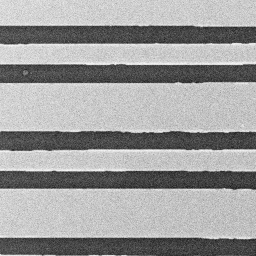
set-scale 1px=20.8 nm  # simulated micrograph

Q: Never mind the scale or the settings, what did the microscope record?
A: lines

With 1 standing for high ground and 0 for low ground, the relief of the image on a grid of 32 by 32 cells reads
11111111111111111111111111111111
11111111111111111111111111111111
11111111111111111111111111111111
00000000000000000000000000000000
00000000000000000000000000000000
00000000000000000000000000000000
11111111111111111111111111111111
11111111111111111111111111111111
00000000000000000000000000000000
00000000000000000000000000000000
11111111111111111111111111111111
11111111111111111111111111111111
11111111111111111111111111111111
11111111111111111111111111111111
11111111111111111111111111111111
11111111111111111111111111111111
00000000000000000000000000000000
00000000000000000000000000000000
00000000000000000000000000000000
11111111111111111111111111111111
11111111111111111111111111111111
00000000000000000000000000000000
00000000000000000000000000000000
00000000000000000000000000000000
11111111111111111111111111111111
11111111111111111111111111111111
11111111111111111111111111111111
11111111111111111111111111111111
11111111111111111111111111111111
11111111111111111111111111111111
00000000000000000000000000000000
00000000000000000000000000000000